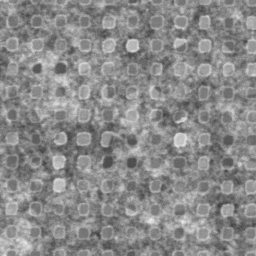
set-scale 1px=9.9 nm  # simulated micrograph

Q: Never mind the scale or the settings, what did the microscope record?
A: a regular array of raised bodies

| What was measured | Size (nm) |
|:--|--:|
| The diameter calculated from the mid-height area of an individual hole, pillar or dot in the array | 127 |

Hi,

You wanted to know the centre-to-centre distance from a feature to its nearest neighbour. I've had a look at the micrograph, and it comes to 230 nanometers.